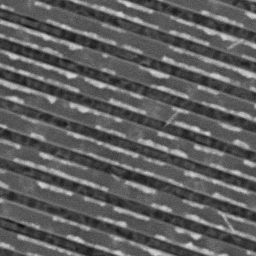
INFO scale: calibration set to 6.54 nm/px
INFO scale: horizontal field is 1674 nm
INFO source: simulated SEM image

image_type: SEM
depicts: parallel lines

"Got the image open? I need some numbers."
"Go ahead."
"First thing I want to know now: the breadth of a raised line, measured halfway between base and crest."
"116 nm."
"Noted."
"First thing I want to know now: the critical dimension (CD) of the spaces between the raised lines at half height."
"10.9 px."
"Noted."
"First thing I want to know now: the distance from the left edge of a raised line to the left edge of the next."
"0.185 micrometres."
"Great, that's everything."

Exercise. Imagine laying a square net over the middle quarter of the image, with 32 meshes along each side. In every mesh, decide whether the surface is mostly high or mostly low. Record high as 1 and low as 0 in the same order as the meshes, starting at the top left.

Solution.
00000011111111111111000000001111
00000000011111111111111000000001
11100000000011111111111111000000
11111100000000011111111111111000
11111111100000000011111111111111
11111111111100000000011111111111
01111111111111100000000011111111
00001111111111111100000000011111
00000001111111111111100000000011
11000000001111111111111100000000
11111000000001111111111111100000
11111111000000001111111111111100
11111111111000000001111111111111
11111111111111000000001111111111
00011111111111111000000001111111
00000011111111111111000000001111
00000000011111111111111000000001
11100000000011111111111111000000
11111100000000011111111111111000
11111111100000000011111111111111
11111111111100000000011111111111
01111111111111100000000011111111
00001111111111111110000000011111
00000001111111111111110000000011
11000000001111111111111110000000
11111000000000111111111111110000
11111111000000000111111111111110
11111111111000000000111111111111
11111111111111000000000111111111
00011111111111111000000000111111
00000001111111111111000000000111
10000000001111111111111000000000